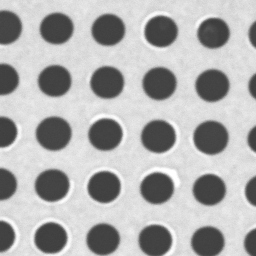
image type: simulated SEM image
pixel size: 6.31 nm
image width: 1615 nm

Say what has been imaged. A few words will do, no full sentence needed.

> a regular array of holes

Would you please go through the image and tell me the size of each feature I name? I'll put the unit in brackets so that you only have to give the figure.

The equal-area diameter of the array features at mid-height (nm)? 207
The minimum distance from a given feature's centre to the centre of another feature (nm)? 328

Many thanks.